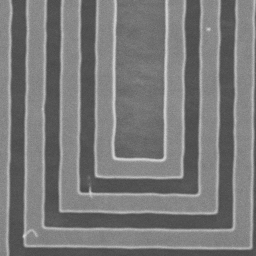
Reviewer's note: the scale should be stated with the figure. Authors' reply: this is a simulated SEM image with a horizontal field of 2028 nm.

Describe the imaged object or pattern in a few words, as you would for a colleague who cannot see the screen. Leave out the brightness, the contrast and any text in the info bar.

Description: groups of lines, slits or small figures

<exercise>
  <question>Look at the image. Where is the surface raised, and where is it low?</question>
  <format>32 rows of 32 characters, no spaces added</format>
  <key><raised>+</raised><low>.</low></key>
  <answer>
+..+++..++..++.......++..+++..++
+..+++..++..++.......++..++...++
+..+++..++..++.......++..++...++
+..+++..++..++.......++..++...++
+..+++..++..++.......++..++..+++
+..+++..++..++.......++..++..+++
+..+++..++..++.......++..++..+++
+..+++..++..++.......++..++..+++
+..+++..++..++.......++..++..+++
+..+++..++..++.......++..++..+++
+..+++..++..++.......++..++..+++
+..+++..++..++.......++..++..+++
+..+++..++..++.......++..++..+++
+..++...++..++.......++..++..+++
+..+++..++..++.......++..++..+++
+..+++..++..++.......++..++..+++
+..+++..++..++.......++..++..+++
+..+++..++..++.......++..++..+++
+..++...++..++.......++..++..+++
+..++...++..++.......++..++..+++
+..+++.+++..+++++++++++..++..+++
+..+++.+++..+++++++++++..++..+++
+..++..+++...............++..+++
+..++..+++...............++..+++
+..++..++++++++++++++++++++..+++
+..++..++++++++++++++++++++..+++
+..++........+++++.++++++++..+++
+..++........................+++
+..++++......................+++
+..+++++++++++++++++++++++++++++
+..+++++++++++++++++++++++++++++
+...............................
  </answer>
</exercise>